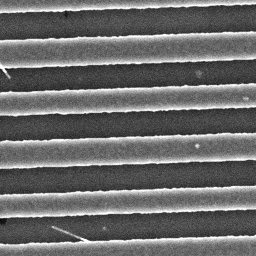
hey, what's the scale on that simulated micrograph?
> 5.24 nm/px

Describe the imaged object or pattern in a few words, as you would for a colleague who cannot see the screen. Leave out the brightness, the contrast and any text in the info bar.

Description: lines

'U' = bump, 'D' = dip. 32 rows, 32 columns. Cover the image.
UUUUUUUUUUUUUUUUUUUUUUUUUUUUUUUU
UUUUDDDDDDDDDDDDDDDDDDDDDDDDDDDD
DDDDDDDDDDDDDDDDDDDDDDDDDDDDDDDD
DDDDDDDDDDDDDDDDDDDDDDDDDDDDDDDD
DDDDDDDDDDDDDDDDDDDUUUUUUUUUUUUU
UUUUUUUUUUUUUUUUUUUUUUUUUUUUUUUU
UUUUUUUUUUUUUUUUUUUUUUUUUUUUUUUU
UUUUUUUUUUUUUUUUUUUUUUUUUUUDDDDD
UDDDDDDDDDDDDDDDDDDDDDDDDDDDDDDD
DDDDDDDDDDDDDDDDDDDDDDDDDDDDDDDD
DDDDDDDDDDDDDDDDDDDDDDDDDDDDDDDU
DUDDUUUUUUUUUUUUUUUUUUUUUUUUUUUU
UUUUUUUUUUUUUUUUUUUUUUUUUUUUUUUU
UUUUUUUUUUUUUUUUUUUUUUUUUUDDDDDD
DDDDDDDDDDDDDDDDDDDDDDDDDDDDDDDD
DDDDDDDDDDDDDDDDDDDDDDDDDDDDDDDD
DDDDDDDDDDDDDDDDDDDDDDDDDDDDDDDD
DDDDDDUUUUUUUUUUUUUUUUUUUUUUUUUU
UUUUUUUUUUUUUUUUUUUUUUUUUUUUUUUU
UUUUUUUUUUUUUUUUUUUUUUUUUUUUUUUU
UUUUUUUUUUUUUUUUDDDDDDDDDDDDDDDD
DDDDDDDDDDDDDDDDDDDDDDDDDDDDDDDD
DDDDDDDDDDDDDDDDDDDDDDDDDDDDDDDD
DDDDDDDDDDDDDDDDDDDDDDDDDUUUUUUU
UUUUUUUUUUUUUUUUUUUUUUUUUUUUUUUU
UUUUUUUUUUUUUUUUUUUUUUUUUUUUUUUU
UUUUUUUUUUUUUUUUUUUUUUDDDDDDDDDD
DDDDDDDDDDDDDDDDDDDDDDDDDDDDDDDD
DDDDDDDDDDDDDDDDDDDDDDDDDDDDDDDD
DDDDDDDDDDDDDDDDDDDDDDDDDDDDDDDD
DDDUUUUUUUUUUUUUUUUUUUUUUUUUUUUU
UUUUUUUUUUUUUUUUUUUUUUUUUUUUUUUU